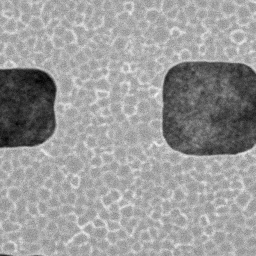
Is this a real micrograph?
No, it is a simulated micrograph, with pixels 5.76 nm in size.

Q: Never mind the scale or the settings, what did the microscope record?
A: holes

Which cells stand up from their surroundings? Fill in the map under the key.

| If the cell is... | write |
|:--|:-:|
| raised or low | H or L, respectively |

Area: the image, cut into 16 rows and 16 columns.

HHHHHHHHHHHHHHHH
HHHHHHHHHHHHHHHH
HHHHHHHHHHHHHHHH
HHHHHHHHHHHHHHHH
LLLHHHHHHHHLLLLL
LLLHHHHHHHLLLLLL
LLLHHHHHHHLLLLLL
LLLHHHHHHHLLLLLL
LLLHHHHHHHLLLLLL
HHHHHHHHHHHLLLLH
HHHHHHHHHHHHHHHH
HHHHHHHHHHHHHHHH
HHHHHHHHHHHHHHHH
HHHHHHHHHHHHHHHH
HHHHHHHHHHHHHHHH
HHHHHHHHHHHHHHHH